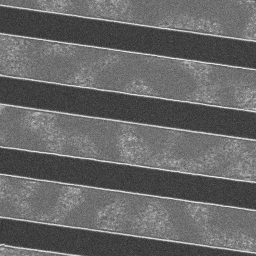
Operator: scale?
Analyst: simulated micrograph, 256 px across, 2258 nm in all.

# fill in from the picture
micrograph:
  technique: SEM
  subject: one or a few lines or trenches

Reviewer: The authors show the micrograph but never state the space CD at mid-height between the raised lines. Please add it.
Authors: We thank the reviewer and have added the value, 362 nanometres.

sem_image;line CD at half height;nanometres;259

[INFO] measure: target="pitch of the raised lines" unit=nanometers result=613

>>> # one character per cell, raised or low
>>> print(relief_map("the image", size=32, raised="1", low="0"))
00000000000000000000000000000000
11111110000000000000000000000000
11111111111111000000000100000000
11111111111111111111100000000000
00111111111111111111111111110000
00000000011111111111111111111111
00000001000000001111111111111111
00000000000000000000000111111111
00000000000000000000000000000011
10000000000000000000000000000000
11111111000000000000000000000000
11111111111111100000000000100000
11111111111111111111110000000000
00011111111111111111111111111000
00000000001111111111111111111111
00000000000000000111111111111111
00000000000000000000000011111111
00000000000000000000000000000001
11000000000000000000000000000000
11111111100000000000000000000000
11111111111111110000000000000000
11111111111111111111111000000010
00001111111111111111111111111100
00000000000011111111111111111111
00000000000000000001111111111111
00000000000000000000000000111111
00000000000010000000000000000000
11100000000000000000000000000000
11111111110000000000000000000000
11111111111111111000000000000000
11111111111111111111111100000000
00000011111111111111111111111110